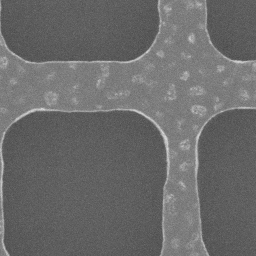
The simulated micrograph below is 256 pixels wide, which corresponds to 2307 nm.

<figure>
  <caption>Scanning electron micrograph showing holes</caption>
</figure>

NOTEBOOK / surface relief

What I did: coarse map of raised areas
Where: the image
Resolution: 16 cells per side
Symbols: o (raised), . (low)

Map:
..........ooo...
..........ooo...
..........ooo...
o........ooooo..
oooooooooooooooo
oooooooooooooooo
oooooooooooooooo
o........oooo...
..........oo....
..........oo....
...........o....
..........oo....
..........oo....
..........ooo...
..........ooo...
..........ooo...